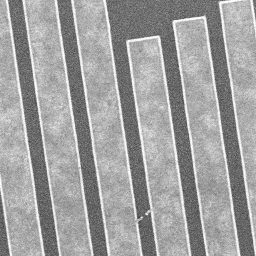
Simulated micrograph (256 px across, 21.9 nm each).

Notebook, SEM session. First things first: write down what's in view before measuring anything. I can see parallel lines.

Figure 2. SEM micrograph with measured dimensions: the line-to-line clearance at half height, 374 nm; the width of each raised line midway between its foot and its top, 688 nm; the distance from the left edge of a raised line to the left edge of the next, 1060 nanometers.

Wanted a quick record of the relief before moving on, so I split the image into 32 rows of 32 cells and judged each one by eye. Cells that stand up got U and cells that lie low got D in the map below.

UDDUUUUDDUUUUDDDDDDDDDDDDDDDUUUU
UDDUUUUDDUUUUDDDDDDDDDDDDDDDUUUU
UDDUUUUDDUUUUDDDDDDDDDDUUUDDUUUU
UDDUUUUDDDUUUUDDDDDDDDUUUUDDUUUU
UDDDUUUUDDUUUUDDDDDDDDUUUUDDUUUU
UUDDUUUUDDUUUUDDUUUUDDUUUUDDUUUU
UUDDUUUUDDUUUUDDUUUUDDUUUUDDUUUU
UUDDUUUUDDUUUUDDUUUUDDUUUUDDUUUU
UUDDUUUUDDUUUUDDUUUUDDUUUUUDDUUU
UUDDUUUUDDUUUUDDDUUUUDDUUUUDDUUU
UUDDUUUUDDDUUUUDDUUUUDDUUUUDDUUU
UUDDDUUUUDDUUUUDDUUUUDDUUUUDDUUU
UUUDDUUUUDDUUUUDDUUUUDDUUUUDDUUU
UUUDDUUUUDDUUUUDDUUUUDDUUUUDDUUU
UUUDDUUUUDDUUUUDDUUUUDDUUUUDDUUU
UUUDDUUUUDDUUUUDDUUUUDDUUUUUDDUU
UUUDDUUUUDDUUUUDDDUUUUDDUUUUDDUU
UUUDDUUUUDDDUUUUDDUUUUDDUUUUDDUU
UUUUDDUUUUDDUUUUDDUUUUDDUUUUDDUU
UUUUDDUUUUDDUUUUDDUUUUDDUUUUDDUU
UUUUDDUUUUDDUUUUDDUUUUDDUUUUDDUU
UUUUDDUUUUDDUUUUDDUUUUDDUUUUDDUU
UUUUDDUUUUDDUUUUDDUUUUDDDUUUUDDU
UUUUDDUUUUDDUUUUDDDUUUUDDUUUUDDU
UUUUDDUUUUDDDUUUUDDUUUUDDUUUUDDU
UUUUUDDUUUUDDUUUUDDUUUUDDUUUUDDU
DUUUUDDUUUUDDUUUUDDUUUUDDUUUUDDU
DUUUUDDUUUUDDUUUUDDUUUUDDUUUUDDU
DUUUUDDUUUUDDUUUUDDUUUUDDUUUUDDU
DUUUUDDUUUUDDUUUUDDUUUUDDDUUUUDD
DUUUUDDUUUUDDUUUUDDDUUUUDDUUUUDD
DUUUUDDUUUUUDDUUUUDDUUUUDDUUUUDD